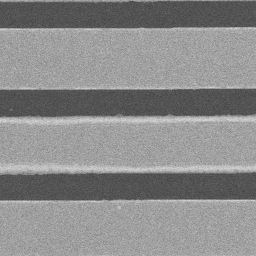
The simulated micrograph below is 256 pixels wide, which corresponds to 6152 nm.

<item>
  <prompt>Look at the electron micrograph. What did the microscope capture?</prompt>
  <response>lines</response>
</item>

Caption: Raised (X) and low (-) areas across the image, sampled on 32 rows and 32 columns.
--------------------------------
--------------------------------
--------------------------------
--------------------------------
XXXXXXXXXXXXXXXXXXXXXXXXXXXXXXXX
XXXXXXXXXXXXXXXXXXXXXXXXXXXXXXXX
XXXXXXXXXXXXXXXXXXXXXXXXXXXXXXXX
XXXXXXXXXXXXXXXXXXXXXXXXXXXXXXXX
XXXXXXXXXXXXXXXXXXXXXXXXXXXXXXXX
XXXXXXXXXXXXXXXXXXXXXXXXXXXXXXXX
XXXXXXXXXXXXXXXXXXXXXXXXXXXXXXXX
--------------------------------
--------------------------------
--------------------------------
--------------------------------
XXXXXXXXXXXXXXXXXXXXXXXXXXXXXXXX
XXXXXXXXXXXXXXXXXXXXXXXXXXXXXXXX
XXXXXXXXXXXXXXXXXXXXXXXXXXXXXXXX
XXXXXXXXXXXXXXXXXXXXXXXXXXXXXXXX
XXXXXXXXXXXXXXXXXXXXXXXXXXXXXXXX
XXXXXXXXXXXXXXXXXXXXXXXXXXXXXXXX
--------------------------------
--------------------------------
--------------------------------
--------------------------------
XXXXXXXXXXXXXXXXXXXXXXXXXXXXXXXX
XXXXXXXXXXXXXXXXXXXXXXXXXXXXXXXX
XXXXXXXXXXXXXXXXXXXXXXXXXXXXXXXX
XXXXXXXXXXXXXXXXXXXXXXXXXXXXXXXX
XXXXXXXXXXXXXXXXXXXXXXXXXXXXXXXX
XXXXXXXXXXXXXXXXXXXXXXXXXXXXXXXX
XXXXXXXXXXXXXXXXXXXXXXXXXXXXXXXX